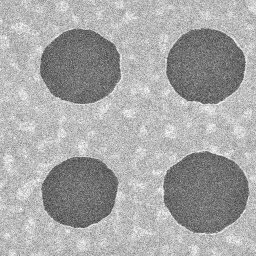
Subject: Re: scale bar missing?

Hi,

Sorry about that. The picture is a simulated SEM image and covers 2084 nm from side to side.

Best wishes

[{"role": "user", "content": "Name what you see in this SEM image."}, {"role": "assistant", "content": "holes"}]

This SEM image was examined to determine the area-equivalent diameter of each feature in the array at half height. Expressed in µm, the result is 0.637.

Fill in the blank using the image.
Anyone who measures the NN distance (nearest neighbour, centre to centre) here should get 1020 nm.